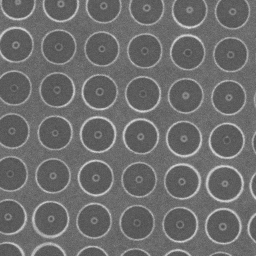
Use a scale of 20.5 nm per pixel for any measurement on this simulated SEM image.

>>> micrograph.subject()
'an array of small figures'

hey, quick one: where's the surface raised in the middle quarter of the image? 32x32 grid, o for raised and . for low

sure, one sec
ooooooooo.oooooooo....oooooo....
oooooooooooooooooooooooooooooooo
oooooooooooooooooooooooooooooooo
.oooooo....ooooooo...ooooooooooo
..ooo.......ooooo......ooooo....
..ooo........ooo........ooo.....
...oo...oo...ooo........oo......
..ooo...o....oo....o....oo....o.
..ooo........ooo........oo......
.oooo.......oooo........oo......
oooooo.....oooooo......oooo.....
oooooooooooooooooo...ooooooo....
oooooooooooooooooooooooooooooooo
ooooooo..ooooooooooooooooooooooo
.oooo......oooooo.....ooooooo..o
..ooo.......oooo.......oooo.....
..oo.........oo........ooo......
..oo....o....oo........ooo......
..oo.........oo....o....oo......
.oooo.......ooo........ooo......
ooooo.......oooo.......ooo......
oooooo....ooooooo.....ooooo.....
oooooooooooooooooooooooooooo....
oooooooooooooooooooooooooooooooo
ooooooo...oooooooooooooooooooooo
.oooo......ooooo.....ooooooo....
.ooo........ooo.......oooo......
.ooo........ooo........ooo......
.ooo...oo...ooo...o....oo.......
.ooo........ooo...o....oo....o..
.ooo........ooo........oo.......
ooooo......oooo.......oooo......